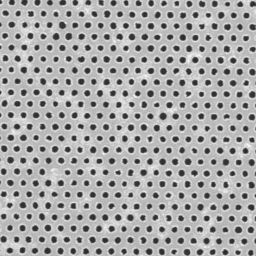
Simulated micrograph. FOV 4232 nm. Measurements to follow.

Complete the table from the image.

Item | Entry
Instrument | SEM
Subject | a regular array of holes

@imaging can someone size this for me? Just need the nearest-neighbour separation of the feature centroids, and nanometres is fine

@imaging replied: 206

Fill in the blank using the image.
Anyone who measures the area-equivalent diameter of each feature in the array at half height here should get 106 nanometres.